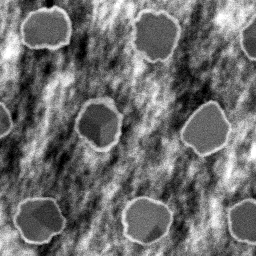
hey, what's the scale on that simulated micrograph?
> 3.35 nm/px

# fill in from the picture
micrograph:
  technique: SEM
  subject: raised bodies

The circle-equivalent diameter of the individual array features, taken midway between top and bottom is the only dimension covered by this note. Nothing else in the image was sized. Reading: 160 nm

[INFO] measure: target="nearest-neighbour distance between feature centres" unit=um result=0.357